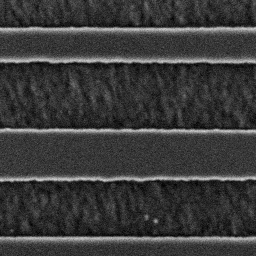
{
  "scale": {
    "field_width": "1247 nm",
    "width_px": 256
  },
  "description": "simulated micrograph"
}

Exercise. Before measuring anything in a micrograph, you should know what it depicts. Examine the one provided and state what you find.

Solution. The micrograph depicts lines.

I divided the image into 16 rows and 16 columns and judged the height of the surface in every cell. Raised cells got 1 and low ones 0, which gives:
0000000000000000
0000000000000000
1111111111111111
1111111111111111
0000000000000000
0000000000000000
0000000000000000
0000000000000000
1111111111111111
1111111111111111
1111111111111111
0000000000000000
0000000000000000
0000000000000000
0000000000000000
1111111111111111